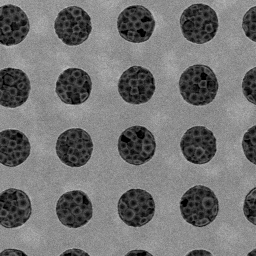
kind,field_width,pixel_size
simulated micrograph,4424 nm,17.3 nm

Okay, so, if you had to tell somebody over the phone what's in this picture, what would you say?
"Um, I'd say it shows a regular array of holes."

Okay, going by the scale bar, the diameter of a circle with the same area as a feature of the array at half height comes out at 32.4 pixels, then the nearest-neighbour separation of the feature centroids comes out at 1.04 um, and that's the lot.